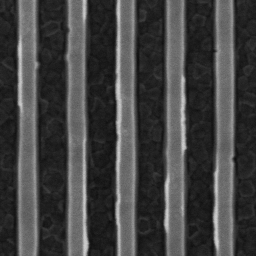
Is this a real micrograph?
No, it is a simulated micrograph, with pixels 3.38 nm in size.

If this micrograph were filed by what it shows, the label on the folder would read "parallel lines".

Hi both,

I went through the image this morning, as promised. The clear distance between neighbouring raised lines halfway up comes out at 98.9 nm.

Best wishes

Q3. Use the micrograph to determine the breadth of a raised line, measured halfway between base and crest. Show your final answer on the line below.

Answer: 65.1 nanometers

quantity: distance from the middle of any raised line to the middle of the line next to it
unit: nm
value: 166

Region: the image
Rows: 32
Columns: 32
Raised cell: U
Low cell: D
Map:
DDUUUDDDUUUDDDDUUDDDDUUDDDDUUDDD
DDUUUDDDUUUDDDDUUDDDDUUDDDDUUDDD
DDUUUDDDUUUDDDDUUDDDDUUDDDDUUDDD
DDUUUDDDDUUDDDDUUDDDDUUDDDDUUDDD
DDUUUDDDUUUDDDDUUDDDDUUDDDDUUDDD
DDUUUDDDUUUDDDDUUDDDDUUDDDDUUDDD
DDUUUDDDUUUDDDDUUDDDDUUDDDDUUDDD
DDUUUDDDUUUDDDDUUDDDDUUDDDDUUDDD
DDUUUDDDUUUDDDUUUDDDDUUDDDDUUDDD
DDUUUDDDUUUDDDUUUDDDDUUDDDDUUDDD
DDUUUDDDUUUDDDUUUDDDDUUDDDDUUDDD
DDUUUDDDUUUDDDUUUDDDDUUDDDDUUDDD
DDUUUDDDUUUDDDUUUDDDDUUDDDDUUDDD
DDUUUDDDUUUDDDDUUDDDDUUDDDDUUDDD
DDUUUDDDUUUDDDDUUDDDDUUDDDDUUDDD
DDUUUDDDUUUDDDUUUDDDDUUDDDDUUDDD
DDUUUDDDUUUDDDDUUDDDDUUDDDDUUDDD
DDUUUDDDUUUDDDDUUDDDDUUDDDDUUDDD
DDUUUDDDDUUDDDDUUDDDDUUDDDDUUDDD
DDUUUDDDDUUDDDDUUDDDDUUDDDDUUDDD
DDUUUDDDUUUDDDUUUDDDDUUDDDDUUDDD
DDUUUDDDUUUDDDUUUDDDDUUDDDDUUDDD
DDUUUDDDUUUDDDUUUDDDDUUDDDDUUDDD
DDUUUDDDDUUDDDUUUDDDDUUDDDDUUDDD
DDUUUDDDDUUDDDUUUDDDDUUDDDDUUDDD
DDUUUDDDUUUDDDUUUDDDDUUDDDDUUDDD
DDUUUDDDUUUDDDUUUDDDDUUDDDDUUDDD
DDUUUDDDUUUDDDUUUDDDDUUDDDDUUDDD
DDUUUDDDUUUDDDDUUDDDDUUDDDDUUDDD
DDUUUDDDUUUDDDDUUDDDDUUDDDDUUDDD
DDUUUDDDUUUDDDDUUDDDDUUDDDDUUDDD
DDUUUDDDUUUDDDDUUDDDDUUDDDDUUDDD